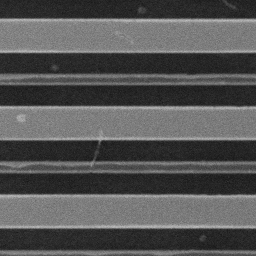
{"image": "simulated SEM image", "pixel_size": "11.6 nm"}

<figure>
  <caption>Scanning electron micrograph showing lines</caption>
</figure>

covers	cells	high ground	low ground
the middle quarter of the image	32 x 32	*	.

................................
................................
................................
********************************
********************************
................................
................................
................................
................................
................................
................................
********************************
********************************
********************************
********************************
********************************
********************************
********************************
********************************
................................
................................
................................
................................
................................
.......*........................
********************************
********************************
................................
................................
................................
................................
................................